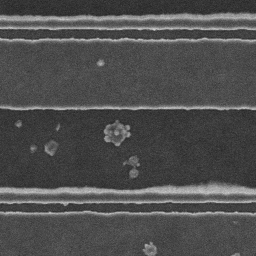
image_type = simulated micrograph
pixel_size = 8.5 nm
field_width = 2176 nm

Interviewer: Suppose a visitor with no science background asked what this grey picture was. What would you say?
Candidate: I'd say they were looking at lines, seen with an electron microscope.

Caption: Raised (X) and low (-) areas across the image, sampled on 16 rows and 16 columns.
----------------
XXXXXXXXXXXXXXXX
XXXXXXXXXXXXXXXX
XXXXXXXXXXXXXXXX
XXXXXXXXXXXXXXXX
XXXXXXXXXXXXXXXX
XXXXXXXXXXXXXXXX
----------------
----------------
----------------
----------------
----------------
XXXXXXXXXXXXXXXX
XXXXXXXXXXXXXXXX
XXXXXXXXXXXXXXXX
XXXXXXXXXXXXXXXX